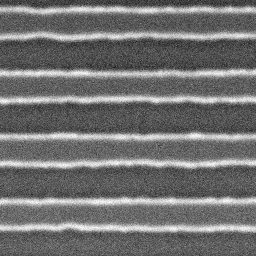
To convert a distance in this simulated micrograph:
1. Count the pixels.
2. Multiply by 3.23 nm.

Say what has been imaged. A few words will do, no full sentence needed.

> lines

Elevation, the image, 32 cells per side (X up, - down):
--------------------------------
XXXXXXXXXXXXXXXXXXXXXXXXXXXXXXXX
XXXXXXXXXXXXXXXXXXXXXXXXXXXXXXXX
XXXXXXXXXXXXXXXXXXXXXXXXXXXXXXXX
XXXXX-XXXXXXXXXXXX-XXXXXXXXXXXXX
--------------------------------
--------------------------------
--------------------------------
--------------------------------
XXXXXXXXXXXXXXXXXXXXXXXXXXXXXXXX
XXXXXXXXXXXXXXXXXXXXXXXXXXXXXXXX
XXXXXXXXXXXXXXXXXXXXXXXXXXXXXXXX
XXXXXXXXXXXXXXXXX-XXXXX-XXXXXXXX
--------------------------------
--------------------------------
--------------------------------
--------------------------------
XXXXXXXXXXXXXXXXXXXXXXXXXXXXXXXX
XXXXXXXXXXXXXXXXXXXXXXXXXXXXXXXX
XXXXXXXXXXXXXXXXXXXXXXXXXXXXXXXX
XXXXXXXXXXXXXXXXX-XXXXXXXXXXX--X
--------------------------------
--------------------------------
--------------------------------
--------------------------------
XXXXXXXXXXXXXXXXXXXXXXXXXXXXXXXX
XXXXXXXXXXXXXXXXXXXXXXXXXXXXXXXX
XXXXXXXXXXXXXXXXXXXXXXXXXXXXXXXX
XXXXXXXX-XXXXXXXXXXXXXXXXXXXXXXX
--------------------------------
--------------------------------
--------------------------------